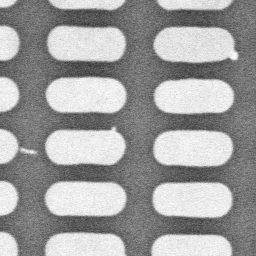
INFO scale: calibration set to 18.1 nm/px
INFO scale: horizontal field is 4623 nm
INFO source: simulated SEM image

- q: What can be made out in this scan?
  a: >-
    groups of lines, slits or small figures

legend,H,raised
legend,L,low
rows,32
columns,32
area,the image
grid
HLLLLLLHHHHHHHHLLLLLHHHHHHHHHLLL
LLLLLLLLLLLLLLLLLLLLLLLLLLLLLLLL
LLLLLLLLLLLLLLLLLLLLLLLLLLLLLLLL
HLLLLLLHHHHHLHLLLLLLLHHHHHLLLLLL
HHLLLLHHHHHHHHHLLLLLHHHHHHHHHLLL
HHLLLLHHHHHHHHHHLLLHHHHHHHHHHLLL
HHLLLLHHHHHHHHHLLLLLHHHHHHHHHLLL
HLLLLLLHHHHHHHHLLLLLLHHHHHHHLLLL
LLLLLLLLLLLLLLLLLLLLLLLLLLLLLLLL
LLLLLLLLLLLLLLLLLLLLLLLLLLLLLLLL
HHLLLLHHHHHHHHHLLLLLHHHHHHHHLLLL
HHLLLLHHHHHHHHHHLLLHHHHHHHHHHLLL
HHLLLLHHHHHHHHHHLLLHHHHHHHHHHLLL
HLLLLLLHHHHHHHHLLLLLHHHHHHHHHLLL
LLLLLLLLLLLLLLLLLLLLLLLLLLLLLLLL
LLLLLLLLLLLLLLLLLLLLLLLLLLLLLLLL
HLLLLLLHHHHHHHLLLLLLLHHHHHLLLLLL
HHLLLLHHHHHHHHHLLLLLHHHHHHHHHLLL
HHLLLLHHHHHHHHHHLLLHHHHHHHHHHLLL
HHLLLLHHHHHHHHHLLLLHHHHHHHHHHLLL
LLLLLLLHHLLLHHLLLLLLLHHHHHHHLLLL
LLLLLLLLLLLLLLLLLLLLLLLLLLLLLLLL
LLLLLLLLLLLLLLLLLLLLLLLLLLLLLLLL
HHLLLLHHHHHHHHHLLLLLHHHHHHHHLLLL
HHLLLLHHHHHHHHHHLLLHHHHHHHHHHLLL
HHLLLLHHHHHHHHHHLLLHHHHHHHHHHLLL
HLLLLLLHHHHHHHHLLLLLHHHHHHHHLLLL
LLLLLLLLLLLLLLLLLLLLLLLLLLLLLLLL
LLLLLLLLLLLLLLLLLLLLLLLLLLLLLLLL
HLLLLLLHHHHHHHLLLLLLHHHHHHHLLLLL
HHLLLLHHHHHHHHHLLLLHHHHHHHHHHLLL
HHLLLLHHHHHHHHHLLLLHHHHHHHHHHLLL